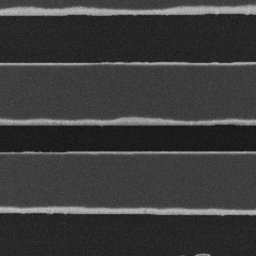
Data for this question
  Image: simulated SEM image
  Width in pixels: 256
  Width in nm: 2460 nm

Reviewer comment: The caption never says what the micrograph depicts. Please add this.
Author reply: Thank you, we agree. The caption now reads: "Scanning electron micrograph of lines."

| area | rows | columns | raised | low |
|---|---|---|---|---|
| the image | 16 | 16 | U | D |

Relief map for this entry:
UUUUUUUUUUUUUUUU
DDDDDDDDDDDDDDDD
DDDDDDDDDDDDDDDD
DDDDDDDDDDDDDDDD
UUUUUUUUUUUUUUUU
UUUUUUUUUUUUUUUU
UUUUUUUUUUUUUUUU
UUUUUUUUUUUUUUUU
DDDDDDDDDDDDDDDD
DDDDDDDDDDDDDDDD
UUUUUUUUUUUUUUUU
UUUUUUUUUUUUUUUU
UUUUUUUUUUUUUUUU
DDDDDDDDDDDDDDDD
DDDDDDDDDDDDDDDD
DDDDDDDDDDDDDDDD